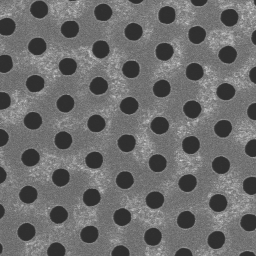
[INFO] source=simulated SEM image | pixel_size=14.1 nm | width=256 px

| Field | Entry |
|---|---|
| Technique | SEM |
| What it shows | a regular array of holes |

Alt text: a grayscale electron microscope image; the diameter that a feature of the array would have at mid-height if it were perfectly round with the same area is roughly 0.256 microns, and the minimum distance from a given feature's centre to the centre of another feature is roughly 0.511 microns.